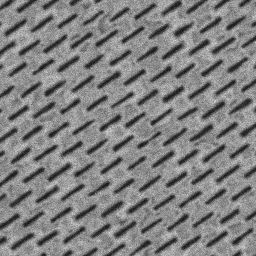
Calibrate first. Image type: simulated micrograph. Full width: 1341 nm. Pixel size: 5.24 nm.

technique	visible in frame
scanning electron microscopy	a regular array of holes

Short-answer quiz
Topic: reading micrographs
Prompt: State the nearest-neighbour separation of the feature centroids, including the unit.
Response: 125 nm